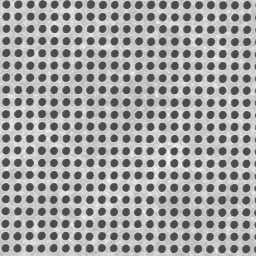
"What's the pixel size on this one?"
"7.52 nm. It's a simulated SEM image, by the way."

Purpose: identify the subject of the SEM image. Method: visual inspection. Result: a regular array of holes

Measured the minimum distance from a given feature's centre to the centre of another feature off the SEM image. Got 11.8 px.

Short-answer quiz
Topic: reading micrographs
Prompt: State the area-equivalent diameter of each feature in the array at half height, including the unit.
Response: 60.6 nm